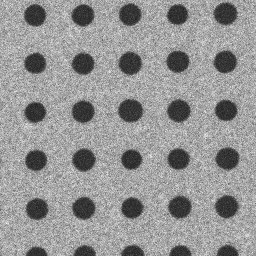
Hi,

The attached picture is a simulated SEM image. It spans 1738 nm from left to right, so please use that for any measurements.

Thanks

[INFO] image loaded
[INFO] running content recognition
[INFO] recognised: a regular array of holes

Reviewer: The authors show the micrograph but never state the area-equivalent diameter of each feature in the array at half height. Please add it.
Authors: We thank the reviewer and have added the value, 146 nm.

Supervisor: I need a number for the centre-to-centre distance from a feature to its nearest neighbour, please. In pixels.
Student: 47.2